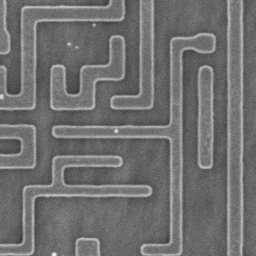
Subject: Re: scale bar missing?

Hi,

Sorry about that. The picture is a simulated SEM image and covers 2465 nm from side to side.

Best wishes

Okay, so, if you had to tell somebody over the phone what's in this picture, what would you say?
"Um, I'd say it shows wiring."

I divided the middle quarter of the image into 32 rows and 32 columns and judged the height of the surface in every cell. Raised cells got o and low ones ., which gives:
..........ooooo....ooo.....oo...
....ooooooooooo....ooo.....oo...
....ooooooooooo....ooo.....oo...
....ooooooooooo....ooo.....oo...
....oooo...........ooo.....oo...
....oooo...........ooo.....oo...
....oooo...........ooo.....oo...
o..oooo............ooo.....oo...
ooooooo.....oooooooooo.....oo...
ooooooo.....oooooooooo.....oo...
ooooooo.....oooooooooo.....oo...
...........................oo...
...........................oo...
...........................oo...
...........................oo...
..........................ooo...
ooooooooooooooooooooooooooooo...
ooooooooooooooooooooooooooooo...
..........................ooo...
...........................oo...
...........................oo...
...........................oo...
...........................oo...
oooooooooooooo.............oo...
oooooooooooooo.............oo...
oo..........o..............oo...
...........................oo...
...........................oo...
...........................oo...
...........................oo...
oooooooo.oooooooooooo......oo...
oooooooooooooooooooooo.....oo...